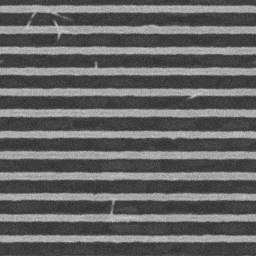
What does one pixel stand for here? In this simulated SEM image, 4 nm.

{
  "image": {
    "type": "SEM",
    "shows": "parallel lines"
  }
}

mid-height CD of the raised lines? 29 nm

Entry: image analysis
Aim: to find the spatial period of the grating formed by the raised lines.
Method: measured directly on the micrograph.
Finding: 83.6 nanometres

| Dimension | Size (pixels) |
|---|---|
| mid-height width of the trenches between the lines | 13.8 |